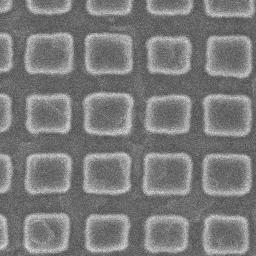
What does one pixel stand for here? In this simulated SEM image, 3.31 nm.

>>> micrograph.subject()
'a regular array of raised bodies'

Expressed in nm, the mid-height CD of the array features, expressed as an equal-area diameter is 147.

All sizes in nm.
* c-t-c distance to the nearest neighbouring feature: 197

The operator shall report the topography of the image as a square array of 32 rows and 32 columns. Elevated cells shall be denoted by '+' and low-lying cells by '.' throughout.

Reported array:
+...+++++..+++++...+++++..++++++
....++++...+++++...++++...+++++.
................................
................................
+...++++...+++++................
+..++++++..+++++...+++++..+++++.
+..++++++..+++++...+++++..+++++.
+..++++++..+++++...+++++..+++++.
+..++++++..+++++...++++...+++++.
..............................+.
................................
................................
+...+++++..+++++...++++...+++++.
+..++++++..+++++...+++++..+++++.
+..++++++..+++++...+++++..+++++.
+..++++++..+++++..++++++..+++++.
...........+++++....+++...+++++.
................................
................................
+...++++...+++++...++++...++.+..
+...+++++..+++++..++++++..+++++.
+...+++++..+++++..++++++..+++++.
+..++++++..+++++..++++++..+++++.
+..+++++...+++++..++++++..+++++.
................................
................................
................................
+..+++++...+++++...++++...+++++.
+..+++++...+++++..+++++...+++++.
+..+++++...+++++..+++++...+++++.
+..+++++...+++++..+++++...+++++.
..........................++++..